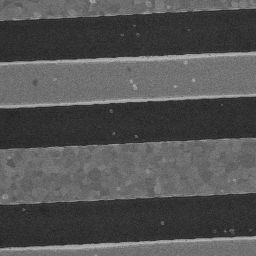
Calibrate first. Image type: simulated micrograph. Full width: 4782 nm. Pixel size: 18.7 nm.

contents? lines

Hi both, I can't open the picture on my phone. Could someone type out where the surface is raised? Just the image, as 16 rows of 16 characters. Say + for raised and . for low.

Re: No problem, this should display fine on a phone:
++++++++++++++++
................
................
............++++
++++++++++++++++
++++++++++++++++
+++++...........
................
................
++++++++++++++++
++++++++++++++++
++++++++++++++++
+++++++.........
................
................
.+++++++++++++++